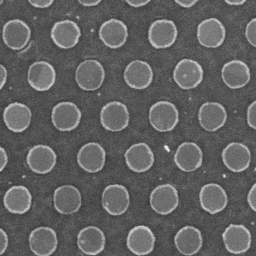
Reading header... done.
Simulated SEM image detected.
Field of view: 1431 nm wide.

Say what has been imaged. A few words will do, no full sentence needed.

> a regular array of raised bodies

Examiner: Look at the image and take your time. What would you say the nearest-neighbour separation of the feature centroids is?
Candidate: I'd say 265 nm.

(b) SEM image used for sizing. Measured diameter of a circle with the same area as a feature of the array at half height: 157 nanometres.